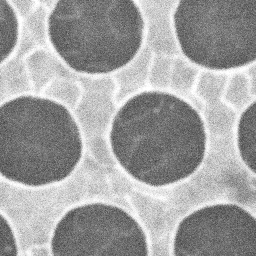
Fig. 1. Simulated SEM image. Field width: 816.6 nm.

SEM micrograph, holes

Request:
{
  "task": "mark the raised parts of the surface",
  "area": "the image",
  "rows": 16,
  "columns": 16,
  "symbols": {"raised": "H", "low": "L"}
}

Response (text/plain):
LHHLLLLLLHHLLLLL
LHHLLLLLLHHLLLLL
LHHLLLLLLHHLLLLL
LHHHLLLLHHHHLLLL
HHHHHLLHHHHHHHHH
HHHHHHHHHHHHHHHH
LLLLHHHHLLLLHHHH
LLLLLHHLLLLLLHHL
LLLLLHHLLLLLLHHL
LLLLLHHLLLLLLHHL
LLLLLHHHLLLLHHHH
HLLHHHHHHLLHHHHH
HHHHHHHHHHHHHHHH
HHHHLLLLHHHHLLLL
LHHLLLLLLHHLLLLL
LHHLLLLLLHHLLLLL